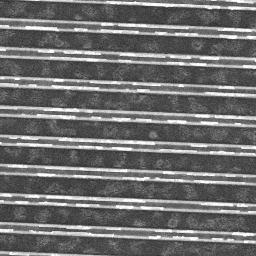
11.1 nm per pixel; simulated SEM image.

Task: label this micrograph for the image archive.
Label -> parallel lines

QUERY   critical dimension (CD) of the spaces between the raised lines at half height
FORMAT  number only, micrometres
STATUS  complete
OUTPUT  0.221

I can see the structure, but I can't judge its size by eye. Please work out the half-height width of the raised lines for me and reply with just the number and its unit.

0.105 microns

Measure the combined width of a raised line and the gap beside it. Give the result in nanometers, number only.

323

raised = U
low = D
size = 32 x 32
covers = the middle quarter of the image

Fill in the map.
DDDDDDDDDDDDDDDDDDDDDDDDDDDDDDDD
DDDDDDDDDDDDDDDDDDDDDDDDDDDDDDDD
DDDDDDDDDDDDDDDDDDDDDDDDDDDDDDDD
DDDDDDDDDDDDDDDDDDDDDDDDDDDDDDDD
UUUUUUUUDDUUUUDDDDDDDDDDDDDDDDDD
UUUUUUUUUUUUUUUUUUUUUUUUUUUUUUUU
DDDDDDDDDDUUUUUUUUUUUUUUUUUUUUUU
DDDDDDDDDDDDDDDDDDDDDDDDDDDDDDDD
DDDDDDDDDDDDDDDDDDDDDDDDDDDDDDDD
DDDDDDDDDDDDDDDDDDDDDDDDDDDDDDDD
DDDDDDDDDDDDDDDDDDDDDDDDDDDDDDDD
UUUUDDDDDDDDDDDDDDDDDDDDDDDDDDDD
UUUUUUUUUUUUUUUUUUUUUUUDDDDDDDDD
UUUUUUUUUUUUUUUUUUUUUUUUUUUUUUUU
DDDDDDDDDDDDDDDDDDDDDDDDUUUUUUUU
DDDDDDDDDDDDDDDDDDDDDDDDDDDDDDDD
DDDDDDDDDDDDDDDDDDDDDDDDDDDDDDDD
DDDDDDDDDDDDDDDDDDDDDDDDDDDDDDDD
UDDDDDDDDDDDDDDDDDDDDDDDDDDDDDDD
UUUUUUUUUUUUUUUUUUUDDDDDDDDDDDDD
UUUUUUUUUUUUUUUUUUUUUUUUUUUUUUUU
DDDDDDDDDDDDDDDDUDDDDUUUUUUUUUUU
DDDDDDDDDDDDDDDDDDDDDDDDDDDDDDDD
DDDDDDDDDDDDDDDDDDDDDDDDDDDDDDDD
DDDDDDDDDDDDDDDDDDDDDDDDDDDDDDDD
DDDDDDDDDDDDDDDDDDDDDDDDDDDDDDDD
UUUUUUUUUUUDDDUUDDDDDDDDDDDDDDDD
UUUUUUUUUUUUUUUUUUUUUUUUUUUUUUUU
DDDDDDDDDDDDUUUUUUUUUUUUUUUUUUUU
DDDDDDDDDDDDDDDDDDDDDDDDDDDDDDDD
DDDDDDDDDDDDDDDDDDDDDDDDDDDDDDDD
DDDDDDDDDDDDDDDDDDDDDDDDDDDDDDDD